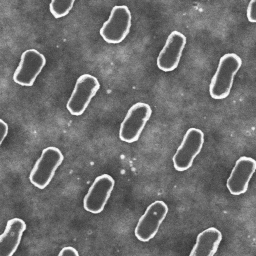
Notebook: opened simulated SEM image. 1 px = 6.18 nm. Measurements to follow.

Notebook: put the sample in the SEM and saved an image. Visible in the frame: a regular array of raised bodies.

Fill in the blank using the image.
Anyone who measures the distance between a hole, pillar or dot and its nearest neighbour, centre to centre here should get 366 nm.